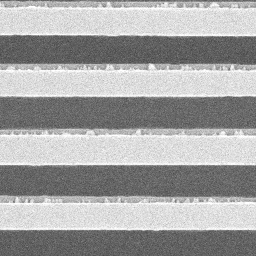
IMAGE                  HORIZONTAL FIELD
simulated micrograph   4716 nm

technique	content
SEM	lines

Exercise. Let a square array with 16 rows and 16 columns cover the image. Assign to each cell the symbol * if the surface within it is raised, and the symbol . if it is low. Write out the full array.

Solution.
****************
****************
................
................
****************
****************
................
................
****************
****************
................
................
****************
****************
................
................